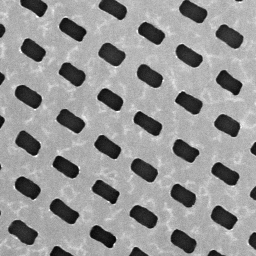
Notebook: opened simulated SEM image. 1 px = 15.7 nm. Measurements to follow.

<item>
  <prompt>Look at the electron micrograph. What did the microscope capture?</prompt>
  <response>a regular array of holes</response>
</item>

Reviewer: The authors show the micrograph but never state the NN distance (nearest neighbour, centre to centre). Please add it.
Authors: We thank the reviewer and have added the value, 0.693 microns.